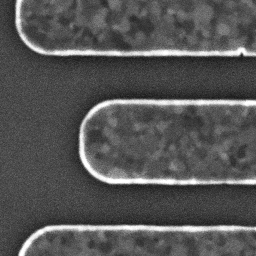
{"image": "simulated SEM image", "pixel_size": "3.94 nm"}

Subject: one or a few lines or trenches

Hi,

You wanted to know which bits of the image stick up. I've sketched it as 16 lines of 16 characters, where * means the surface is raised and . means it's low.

.***************
.***************
..**************
................
................
................
......**********
.....***********
.....***********
.....***********
.....***********
................
................
................
..**************
.***************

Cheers